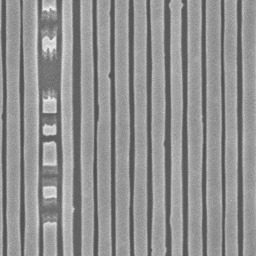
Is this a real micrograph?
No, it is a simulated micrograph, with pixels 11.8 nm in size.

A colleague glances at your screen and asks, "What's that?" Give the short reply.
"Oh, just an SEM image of parallel lines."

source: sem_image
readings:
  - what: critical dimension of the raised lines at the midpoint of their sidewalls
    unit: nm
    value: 159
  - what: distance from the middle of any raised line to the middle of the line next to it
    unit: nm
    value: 214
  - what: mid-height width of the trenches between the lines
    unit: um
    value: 0.0559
